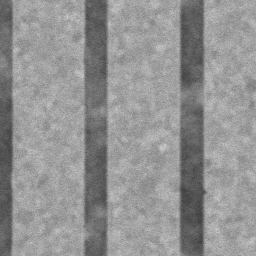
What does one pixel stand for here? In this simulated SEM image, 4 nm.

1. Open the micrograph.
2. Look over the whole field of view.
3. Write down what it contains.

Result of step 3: one or a few lines or trenches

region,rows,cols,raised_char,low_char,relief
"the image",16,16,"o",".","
.oooo..oooo..ooo
.oooo..oooo..ooo
.oooo..oooo..ooo
.oooo..oooo..ooo
.oooo..oooo..ooo
.oooo..oooo..ooo
.oooo..oooo..ooo
.oooo..oooo..ooo
.oooo..oooo..ooo
.oooo..oooo..ooo
.oooo..oooo..ooo
.oooo..oooo..ooo
.oooo..oooo..ooo
.oooo..oooo..ooo
.oooo..oooo..ooo
.oooo..oooo..ooo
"